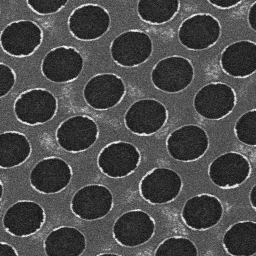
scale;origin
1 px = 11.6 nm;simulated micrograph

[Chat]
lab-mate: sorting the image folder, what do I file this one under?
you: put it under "a regular array of holes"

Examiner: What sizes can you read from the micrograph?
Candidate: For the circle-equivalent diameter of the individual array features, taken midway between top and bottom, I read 0.437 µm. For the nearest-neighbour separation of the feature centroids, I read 48.9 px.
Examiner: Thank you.